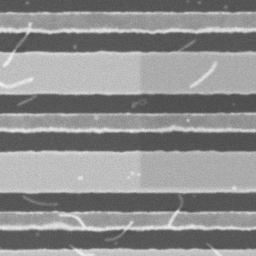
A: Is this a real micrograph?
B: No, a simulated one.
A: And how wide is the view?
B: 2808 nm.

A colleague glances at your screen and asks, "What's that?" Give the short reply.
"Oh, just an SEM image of lines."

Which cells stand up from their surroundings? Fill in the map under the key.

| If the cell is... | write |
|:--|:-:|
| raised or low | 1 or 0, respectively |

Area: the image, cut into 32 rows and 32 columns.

00000000000000000000000000000000
00000000000000000000000000000000
11111111111111111111111111111111
11111111111111111111111111111111
00000000000000000000000000000000
00000000000000000000000000000000
01000000000010000000000000000000
11111111111111111111111111111111
11111111111111111111111111111111
11111111111111111111111111111111
11111111111111111111111111111111
11111111111111111111111111111111
00000000000000000000000000000000
00000000000000000000000000000000
11111111111111111111111111111111
11111111111111111111111111111111
00110000000010001000000000000000
00000000000000000000000000000000
00000000000000000000000000000000
11111111111111111111111111111111
11111111111111111111111111111111
11111111111111111111111111111111
11111111111111111111111111111111
11111111111111111111111111111111
00000000000000000000000000000000
00000000000000000000000000000000
00000011000100000000001000001100
11111111111111111111111111111111
11111111111111111111111111111111
00000000000000000000000000000000
00000000000000000000000000000000
11111111111111111111111111111111